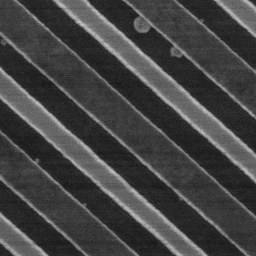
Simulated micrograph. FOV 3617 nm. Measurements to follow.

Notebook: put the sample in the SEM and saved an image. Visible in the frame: lines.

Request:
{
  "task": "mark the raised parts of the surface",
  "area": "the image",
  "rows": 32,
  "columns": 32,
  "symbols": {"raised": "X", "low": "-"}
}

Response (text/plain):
XXX----XXXX-----XXXXXX------XXX-
XXXX----XXXX-----XXXXXXX-----XXX
XXXXX-----XXX-----XXXXXXX-----XX
XXXXXX-----XXX-----XXXXXXX-----X
XXXXXXX-----XXXX----XXXXXXX-----
-XXXXXXX-----XXXX-----XXXXXX----
--XXXXXXX-----XXXX-----XXXXXX---
---XXXXXXX-----XXXX-----XXXXXX--
-----XXXXXX-----XXXX-----XXXXXX-
X-----XXXXXXX----XXXX-----XXXXXX
XX-----XXXXXX-----XXXX-----XXXXX
XXX-----XXXXXXX-----XXX-----XXXX
XXXX-----XXXXXXX-----XXX-----XXX
--XXXX----XXXXXXX-----XXX-----XX
---XXXX----XXXXXXX-----XXXX-----
----XXXX----XXXXXXX-----XXXX----
-----XXXX-----XXXXXX-----XXXX---
X-----XXXX-----XXXXXX-----XXXX--
XX-----XXXX-----XXXXXX-----XXXX-
XXXX----XXXX-----XXXXXXX-----XXX
XXXXX----XXXX-----XXXXXXX-----XX
XXXXXX-----XXX-----XXXXXXX-----X
XXXXXXX-----XXX-----XXXXXXX-----
-XXXXXXX-----XXX-----XXXXXXX----
--XXXXXXX-----XXXX----XXXXXXX---
----XXXXXX-----XXXX-----XXXXXX--
-----XXXXXX-----XXXX-----XXXXXX-
X-----XXXXXX-----XXXX-----XXXXXX
XX-----XXXXXX------XXX-----XXXXX
XXX-----XXXXXXX-----XXX-----XXXX
XXXX-----XXXXXXX-----XXX-----XXX
--XXX-----XXXXXXX-----XXX-----XX